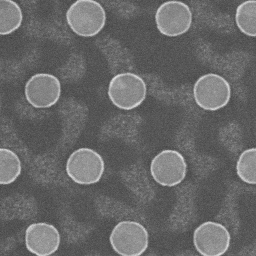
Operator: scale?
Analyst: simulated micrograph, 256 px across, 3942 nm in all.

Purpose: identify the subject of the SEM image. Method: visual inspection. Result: raised bodies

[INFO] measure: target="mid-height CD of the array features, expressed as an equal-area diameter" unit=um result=0.534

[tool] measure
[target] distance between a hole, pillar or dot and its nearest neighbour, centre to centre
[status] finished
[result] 1280 nm